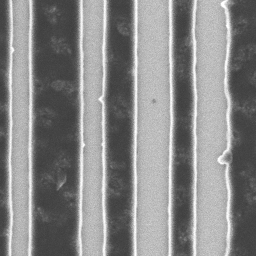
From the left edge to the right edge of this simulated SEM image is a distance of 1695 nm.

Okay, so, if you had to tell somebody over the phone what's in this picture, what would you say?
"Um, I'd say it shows one or a few lines or trenches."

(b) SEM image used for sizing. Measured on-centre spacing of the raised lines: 420 nm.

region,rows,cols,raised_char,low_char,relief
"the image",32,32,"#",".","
#...######...####....###....####
#...######...####....###....####
##..######...####....###....####
##..######...####....###....####
##..######...####....###.....###
##..######...####....###.....###
##..######...####....###....####
#...######...####....###....####
#...######...####....###....####
#...######...####....###....####
#...######...####....###....####
#...######...####....####...####
#...######...####....####...####
#...######...####....####...####
#...######...####....####...####
#...######...####....###....####
#...######...####....###.....###
#...######...####....###.....###
#...######...####....###....####
#...######...####....###....####
#...######...####....###....####
#...######...####....###....####
#...######...####....###....####
#...######...####....###.....###
#...######...####....###.....###
#...######...####....###.....###
#...######...####....###....####
#...######...####....###....####
#...######...####....###.....###
#...######...####....###.....###
#...######...####....###.....###
#...######...####....###....####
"